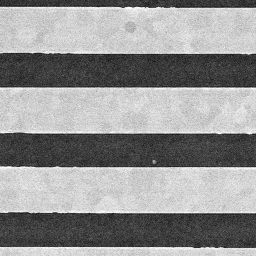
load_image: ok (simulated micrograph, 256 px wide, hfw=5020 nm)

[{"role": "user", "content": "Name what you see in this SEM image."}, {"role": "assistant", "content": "lines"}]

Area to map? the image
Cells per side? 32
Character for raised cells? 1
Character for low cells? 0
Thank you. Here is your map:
00000000000000000000000000000000
11111111111111111111111111111111
11111111111111111111111111111111
11111111111111111111111111111111
11111111111111111111111111111111
11111111111111111111111111111111
11111111111111111111111111111111
00000000000000000000000000000000
00000000000000000000000000000000
00000000000000000000000000000000
00000000000000000000000000000000
11111111111111111111111111111111
11111111111111111111111111111111
11111111111111111111111111111111
11111111111111111111111111111111
11111111111111111111111111111111
11011111111111111111111111111111
00000000000000000000000000000000
00000000000000000000000000000000
00000000000000000000000000000000
00000000000000000000000000000000
11111111111111111111111111111111
11111111111111111111111111111111
11111111111111111111111111111111
11111111111111111111111111111111
11111111111111111111111111111111
10011111111111111111111111111111
00000000000000000000000000000000
00000000000000000000000000000000
00000000000000000000000000000000
00000000000000000000000000000000
11111111111111111111111111111111